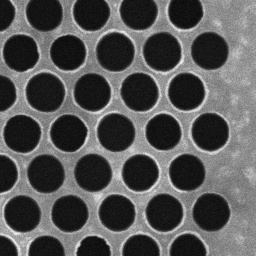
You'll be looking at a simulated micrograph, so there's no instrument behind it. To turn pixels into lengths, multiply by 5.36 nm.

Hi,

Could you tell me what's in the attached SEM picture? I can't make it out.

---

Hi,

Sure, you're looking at a regular array of holes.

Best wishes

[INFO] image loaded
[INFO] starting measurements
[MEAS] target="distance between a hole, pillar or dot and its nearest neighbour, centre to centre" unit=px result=46.3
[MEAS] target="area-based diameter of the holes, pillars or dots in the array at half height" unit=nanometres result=194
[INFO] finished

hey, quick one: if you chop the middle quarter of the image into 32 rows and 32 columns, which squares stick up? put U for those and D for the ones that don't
DDDDUUUUUUDDDDDDUUUUUUDDDDDDUUUU
DUUUUUUUUUUDDDDUUUUUUUUDDDUUUUUU
UUUUUUDDUUUUUUUUUDDDUUUUUUUUUDDU
UUUUDDDDDDUUUUUUDDDDDDUUUUUUDDDD
UUUDDDDDDDDUUUUDDDDDDDDUUUUDDDDD
UUUDDDDDDDDUUUDDDDDDDDDUUUUDDDDD
UUUDDDDDDDDDUUDDDDDDDDDUUUDDDDDD
UUUDDDDDDDDDUUDDDDDDDDDUUUDDDDDD
UUUDDDDDDDDUUUUDDDDDDDDUUUDDDDDD
UUUDDDDDDDDUUUUDDDDDDDDUUUUDDDDD
UUUUDDDDDDUUUUUUDDDDDDUUUUUUDDDD
UUUUUUDDUUUUUUUUUUDDDUUUUUUUUUUU
UUUUUUUUUUUUDUUUUUUUUUUUDUUUUUUU
DDDUUUUUUUDDDDDDUUUUUUDDDDDUUUUU
DDDDDUUUUDDDDDDDDUUUUDDDDDDDUUUU
DDDDDUUUUDDDDDDDDUUUUDDDDDDDDUUU
DDDDDDUUDDDDDDDDDDUUUDDDDDDDDUUU
DDDDDDUUDDDDDDDDDDUUUDDDDDDDDUUU
DDDDDUUUUDDDDDDDDDUUUDDDDDDDDUUU
DDDDDUUUUDDDDDDDDUUUUDDDDDDDDUUU
DDDDUUUUUUDDDDDDUUUUUUDDDDDDUUUU
DDDUUUUUUUUDDDDUUUUUUUUUDDUUUUUU
UUUUUUUUUUUUUUUUUUUUUUUUUUUUUUUU
UUUUUDDDDDUUUUUUUDDDDUUUUUUUDDDD
UUUUDDDDDDDUUUUUDDDDDDDUUUUDDDDD
UUUDDDDDDDDUUUUDDDDDDDDUUUUDDDDD
UUUDDDDDDDDDUUUDDDDDDDDUUUDDDDDD
UUUDDDDDDDDDUUUDDDDDDDDDUUUDDDDD
UUUDDDDDDDDDUUUDDDDDDDDUUUUDDDDD
UUUDDDDDDDDUUUUDDDDDDDDUUUUDDDDD
UUUUDDDDDDDUUUUUDDDDDDUUUUUUDDDD
UUUUUDDDDUUUUUUUUUDDUUUUUUUUUUDD